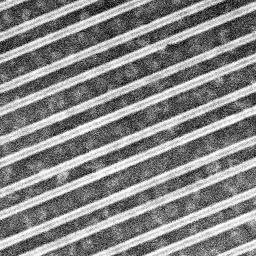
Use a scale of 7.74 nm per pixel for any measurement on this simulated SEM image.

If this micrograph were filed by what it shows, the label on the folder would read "parallel lines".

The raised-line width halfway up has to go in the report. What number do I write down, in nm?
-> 47.3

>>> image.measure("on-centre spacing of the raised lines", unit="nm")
186